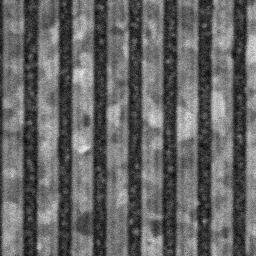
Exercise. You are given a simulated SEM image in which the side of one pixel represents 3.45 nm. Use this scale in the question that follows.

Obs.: parallel lines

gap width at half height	63.7	nanometers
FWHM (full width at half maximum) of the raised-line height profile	56.8	nanometers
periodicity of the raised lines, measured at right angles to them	34.8	px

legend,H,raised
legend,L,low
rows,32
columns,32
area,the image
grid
LHHLLHHLLHHLLLHHLLHHLLLHLLLHHLLH
LHHLLHHLLHHLLLHHLLHHLLLHLLLHHLLH
LHHLLHHLLHHLLLHHLLHHLLLHLLLHHLLH
LHHLLHHLLHHLLLHHLLHHLLHHLLLHHLLH
LHHLLHHLLHHLLLHHLLHHLLHHHLLHHLLH
LHHLLHHLLHHLLLHHLLHHLLHHLLLHHLLH
LHHLLHHLLHHLLLHHLLHHLLHHLLLHHLLH
LHHLLHHLLHHLLLHHLLHHLLHHLLLHHLLH
LHHLLHHLLHHLLLHHLLHHLLHHLLLHHLLH
LHHLLHHLLHHLLLHHLLHHLLHHLLLHHLLH
LHHLLHHLLHHLLLHHLLHHLLHHLLLHHLLH
LHHLLHHLLHHLLLHHLLHHLLHHLLLHHLLH
LHHLLHHLLHHLLLHHLLHHLLHHLLLHHLLH
LHHLLHHLLHHLLLHHLLHHLLHHLLLHHLLH
LHHLLHHLLHHLLLHHLLHHLLHHLLLHHLLH
LHHLLHHLLHHLLLHHLLHHLLHHLLLHHLLH
LHHLLHHLLHHLLLHHLLHHLLHHLLLHHLLH
LHHLLHHLLHHLLLHHLLHHLLHHLLLHHLLH
LHHLLHHLLHHLLLHHLLHHLLHHLLLHHLLH
LHHLLHHLLHHLLLHHLLHHLLHHLLLHHLLH
LHHLLHHLLHHLLLHHLLHHLLHHLLLHHLLH
LHHLLHHLLHHLLLHHLLHHLLHHLLLHHLLH
LHHLLHHLLHHLLLHHLLHHLLHHLLLHHLLH
LHHLLHHLLHHLLLHHLLHHLLHHLLLHHLLH
LHHLLHHLLHHLLLHHLLHHLLHHLLLHHLLH
LHHLLHHLLHHLLLHHLLHHLLHHLLLHHLLH
LHHLLHHLLHHLLLHHLLHHLLHHLLLHHLLH
LHHLLHHLLHHLLLHHLLHHLLHHLLLHHLLH
LHHLLHHLLHHLLLHHLLHHLLHHLLLHHLLH
LHHLLHHLLHHLLLHHLLHHLLHHLLLHHLLH
LHHLLHHLLHHLLLHHLLHHLLHHLLLHHLLH
LHHLLHHLLHHLLLHHLLHHLLHHLLLHHLLH